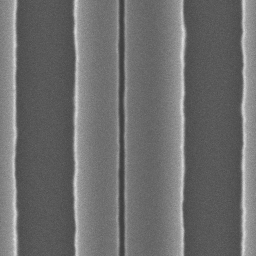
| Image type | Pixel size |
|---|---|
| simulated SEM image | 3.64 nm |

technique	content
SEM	lines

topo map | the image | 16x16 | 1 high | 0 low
1000011111100001
1000011111100001
1000011111100001
1000011111100001
1000011111100001
1000011111100001
1000011111100001
1000011111100001
1000011111100001
1000011111100001
1000011111100001
1000011111100001
1000011111100001
1000011111100001
1000011111100001
1000011111100001